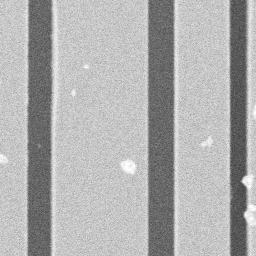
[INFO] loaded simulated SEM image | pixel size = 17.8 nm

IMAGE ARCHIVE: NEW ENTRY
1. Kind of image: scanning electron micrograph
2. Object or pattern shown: lines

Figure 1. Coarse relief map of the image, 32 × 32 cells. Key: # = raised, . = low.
###....###########....#######..#
###....###########....#######..#
###....###########....#######..#
###....###########....#######..#
###....###########....#######..#
###....###########....#######..#
###....###########....#######..#
###....###########....#######..#
###....###########....#######..#
###....###########....#######..#
###....###########....#######..#
###....###########....#######..#
###....###########....#######..#
###....###########....#######..#
###....###########....#######..#
###....###########....#######..#
###....###########....#######..#
###....###########....#######..#
###....###########....#######..#
###....###########....#######..#
###....###########....#######..#
###....###########....#######..#
###....###########....#######.##
###....###########....#######..#
###....###########....#######..#
###....###########....#######..#
###....###########....#######..#
###....###########....#######..#
###....###########....#######..#
###....###########....#######..#
###....###########....#######..#
###....###########....#######..#